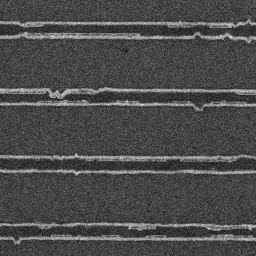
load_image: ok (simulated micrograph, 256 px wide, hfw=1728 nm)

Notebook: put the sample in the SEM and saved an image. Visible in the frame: one or a few lines or trenches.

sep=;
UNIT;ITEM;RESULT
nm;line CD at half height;99.6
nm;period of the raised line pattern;454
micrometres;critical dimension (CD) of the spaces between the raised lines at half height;0.353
